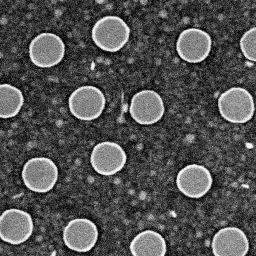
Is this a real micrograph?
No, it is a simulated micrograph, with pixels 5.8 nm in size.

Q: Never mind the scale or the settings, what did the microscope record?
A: a regular array of raised bodies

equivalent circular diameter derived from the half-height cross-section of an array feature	196	nanometres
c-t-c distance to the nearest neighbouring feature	0.394	um